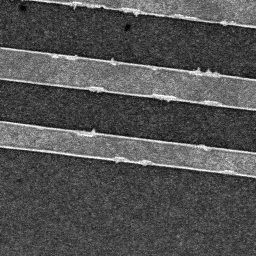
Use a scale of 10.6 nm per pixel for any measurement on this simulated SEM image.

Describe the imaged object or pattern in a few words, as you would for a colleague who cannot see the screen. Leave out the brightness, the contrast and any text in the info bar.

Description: one or a few lines or trenches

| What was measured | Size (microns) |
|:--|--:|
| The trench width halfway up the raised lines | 0.461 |